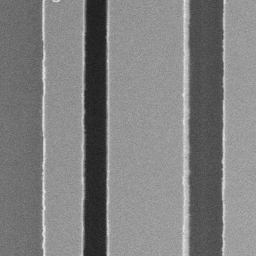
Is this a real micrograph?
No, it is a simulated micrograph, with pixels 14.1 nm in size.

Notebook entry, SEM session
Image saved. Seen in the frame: lines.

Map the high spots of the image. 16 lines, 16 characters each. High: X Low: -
---XX--XXXXX--XX
---XX--XXXXX--XX
---XX--XXXXX--XX
---XX--XXXXX--XX
---XX--XXXXX--XX
---XX--XXXXX--XX
---XX--XXXXX--XX
---XX--XXXXX--XX
---XX--XXXXX--XX
---XX--XXXXX--XX
---XX--XXXXX--XX
---XX--XXXXX--XX
---XX--XXXXX--XX
---XX--XXXXX--XX
---XX--XXXXX--XX
---XX--XXXXX--XX